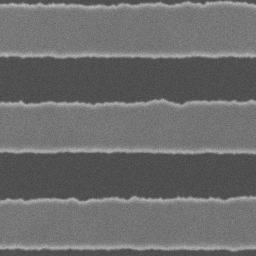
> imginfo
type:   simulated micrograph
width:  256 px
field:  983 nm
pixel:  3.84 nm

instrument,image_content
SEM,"lines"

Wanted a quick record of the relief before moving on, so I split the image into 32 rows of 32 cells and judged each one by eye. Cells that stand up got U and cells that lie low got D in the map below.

DUUDDDUDDDDDDDDDDDUUUDUUUUUUUUUD
UUUUUUUUUUUUUUUUUUUUUUUUUUUUUUUU
UUUUUUUUUUUUUUUUUUUUUUUUUUUUUUUU
UUUUUUUUUUUUUUUUUUUUUUUUUUUUUUUU
UUUUUUUUUUUUUUUUUUUUUUUUUUUUUUUU
UUUUUUUUUUUUUUUUUUUUUUUUUUUUUUUU
UUUUUUUUUUUUUUUUUUUUUUUUUUUUUUUU
DDDDDDDDDDDDDDDDDDDDDDDDDDDDDDDD
DDDDDDDDDDDDDDDDDDDDDDDDDDDDDDDD
DDDDDDDDDDDDDDDDDDDDDDDDDDDDDDDD
DDDDDDDDDDDDDDDDDDDDDDDDDDDDDDDD
DDDDDDDDDDDDDDDDDDDDDDDDDDDDDDDD
DDDDDDDDDDDDDDDDDDDDUDDDDDDDDDDD
UUUUUUUUUUUUUUUUUUUUUUUUUUUUUUUU
UUUUUUUUUUUUUUUUUUUUUUUUUUUUUUUU
UUUUUUUUUUUUUUUUUUUUUUUUUUUUUUUU
UUUUUUUUUUUUUUUUUUUUUUUUUUUUUUUU
UUUUUUUUUUUUUUUUUUUUUUUUUUUUUUUU
UUUUUUUUUUUUUUUUUUUUUUUUUUUUUUUU
DDDDDDDDDDDDDDDDDDDDDDDDDDDDDDDD
DDDDDDDDDDDDDDDDDDDDDDDDDDDDDDDD
DDDDDDDDDDDDDDDDDDDDDDDDDDDDDDDD
DDDDDDDDDDDDDDDDDDDDDDDDDDDDDDDD
DDDDDDDDDDDDDDDDDDDDDDDDDDDDDDDD
DDDDDDDDDDDDDDDDDDDDDDDDDDDDDDDD
UUUUUUUUUUUUUUUUUUUUUUUUUUUUUUUU
UUUUUUUUUUUUUUUUUUUUUUUUUUUUUUUU
UUUUUUUUUUUUUUUUUUUUUUUUUUUUUUUU
UUUUUUUUUUUUUUUUUUUUUUUUUUUUUUUU
UUUUUUUUUUUUUUUUUUUUUUUUUUUUUUUU
UUUUUUUUUUUUUUUUUUUUUUUUUUUUUUUU
DDDDDDDDDDDDDDDDDDDDDDDDDDDDDDDD